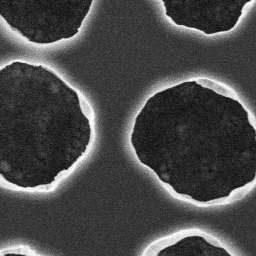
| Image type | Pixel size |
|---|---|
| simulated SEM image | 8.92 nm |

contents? holes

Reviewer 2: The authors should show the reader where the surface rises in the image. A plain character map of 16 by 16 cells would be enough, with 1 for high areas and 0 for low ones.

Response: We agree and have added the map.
0000001111000001
1000011111100001
1100111111111111
1111111111111111
0001111111111111
0000111111100111
0000011110000001
0000011100000000
0000001100000000
0000011100000000
0000111110000000
1001111111000001
1111111111110011
1111111111111111
1111111111111111
1111111111000011